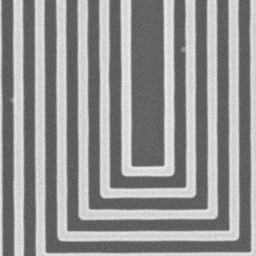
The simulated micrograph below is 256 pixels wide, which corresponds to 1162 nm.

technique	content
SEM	groups of lines, slits or small figures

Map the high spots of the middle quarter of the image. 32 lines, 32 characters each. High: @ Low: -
----@@---@@----@---------@@----@
----@@---@@----@---------@@----@
----@@---@@----@---------@@----@
----@@---@@----@@--------@@----@
----@@---@@----@@--------@@----@
----@@---@@----@@--------@@----@
----@@---@@---@@@--------@@----@
----@@---@@---@@@--------@@----@
----@@---@@---@@@--------@@----@
----@@---@@---@@@--------@@----@
----@@---@@---@@@--------@@----@
----@@---@@---@@@--------@@----@
----@@---@@----@@--------@@@---@
----@@---@@----@@--------@@@---@
----@@---@@----@@--------@@@---@
----@@---@@----@@--------@@@---@
----@@---@@----@@--------@@----@
----@@---@@----@@--------@@----@
----@@---@@----@@--------@@----@
----@@---@@----@@--------@@----@
----@@---@@----@@--------@@----@
@---@@---@@----@@--------@@----@
@---@@---@@----@@--------@@----@
@---@@---@@----@@--------@@@---@
----@@---@@----@@--------@@@---@
----@@---@@----@@--------@@@---@
@---@@---@@----@@@@@@@@@@@@@---@
@---@@---@@----@@@@@@@@@@@@----@
@---@@---@@--------------------@
@---@@---@@--------------------@
@---@@---@@--------------------@
@---@@---@@@@@@@@@@@@@@@@@@@@@@@